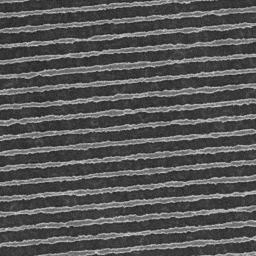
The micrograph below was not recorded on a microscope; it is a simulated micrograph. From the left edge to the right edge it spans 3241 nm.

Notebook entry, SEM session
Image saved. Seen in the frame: parallel lines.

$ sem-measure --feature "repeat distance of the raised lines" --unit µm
0.193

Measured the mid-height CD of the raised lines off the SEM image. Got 47.3 nm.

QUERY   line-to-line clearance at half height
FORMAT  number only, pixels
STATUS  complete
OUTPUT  11.5